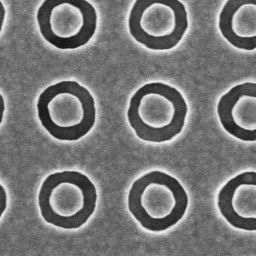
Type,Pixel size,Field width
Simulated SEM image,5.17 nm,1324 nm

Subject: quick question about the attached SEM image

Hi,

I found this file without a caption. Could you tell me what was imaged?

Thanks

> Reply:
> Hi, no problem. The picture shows ring-shaped grooves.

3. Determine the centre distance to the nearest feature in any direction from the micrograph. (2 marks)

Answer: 455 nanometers